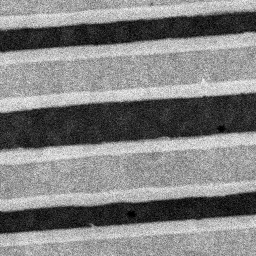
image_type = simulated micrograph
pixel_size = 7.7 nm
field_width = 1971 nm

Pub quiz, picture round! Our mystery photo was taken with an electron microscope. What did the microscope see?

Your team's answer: one or a few lines or trenches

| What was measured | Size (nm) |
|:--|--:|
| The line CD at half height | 357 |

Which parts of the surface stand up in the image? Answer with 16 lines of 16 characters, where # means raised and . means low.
#############...
................
................
...#############
################
##############..
#...............
................
................
.....###########
################
################
####............
................
........########
################